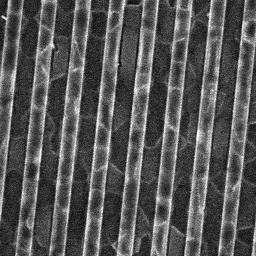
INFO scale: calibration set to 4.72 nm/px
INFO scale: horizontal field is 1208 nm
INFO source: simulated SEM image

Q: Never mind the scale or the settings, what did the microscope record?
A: parallel lines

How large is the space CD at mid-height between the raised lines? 91.6 nm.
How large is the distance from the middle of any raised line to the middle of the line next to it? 159 nm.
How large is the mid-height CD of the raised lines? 66.8 nanometers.